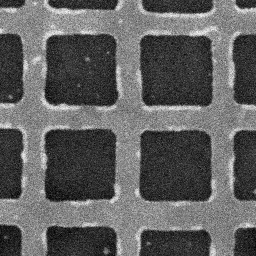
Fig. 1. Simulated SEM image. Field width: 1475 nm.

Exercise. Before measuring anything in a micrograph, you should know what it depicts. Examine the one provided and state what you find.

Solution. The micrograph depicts holes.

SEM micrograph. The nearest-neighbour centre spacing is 547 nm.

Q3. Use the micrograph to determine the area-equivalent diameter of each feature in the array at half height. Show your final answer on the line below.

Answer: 462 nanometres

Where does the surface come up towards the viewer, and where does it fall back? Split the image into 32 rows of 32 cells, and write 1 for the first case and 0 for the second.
00011100000000011100000000011000
11111111111111111110000000111111
11111111111111111111111111111111
11111111111111111111111111111111
00111100000000111100000000011100
00011100000000011000000000011000
00011100000000011000000000011000
00011100000000011000000000011000
00011100000000011000000000011000
00011100000000011000000000011000
00011100000000011100000000011000
00011100000000011100000000011000
00011100000000011100000000011000
11111111111111111111111111111111
11111111111111111111111111111111
11111111111111111111111111111111
00011100000000111100000000111100
00011100000000011000000000111000
00011100000000011100000000011000
00011100000000011100000000011000
00011100000000011000000000111000
00011100000000011000000000111000
00011100000000111000000000111000
00011100000000111000000000111000
00011100000000111100000000111000
11111111111111111111111111111111
11111111111111111111111111111111
11111111111111111111111111111111
00111100000000111111111111111100
00011100000000011100000000111000
00011100000000011000000000111000
00011100000000011000000000111000